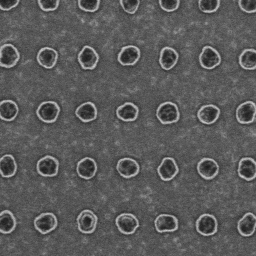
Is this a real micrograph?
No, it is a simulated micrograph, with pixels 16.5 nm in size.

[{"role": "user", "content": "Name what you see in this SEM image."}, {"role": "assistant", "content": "a regular array of raised bodies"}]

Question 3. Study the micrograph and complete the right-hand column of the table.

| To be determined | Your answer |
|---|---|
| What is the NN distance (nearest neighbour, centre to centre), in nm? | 661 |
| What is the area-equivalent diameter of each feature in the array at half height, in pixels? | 19.5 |